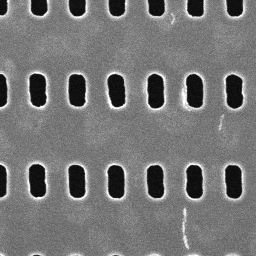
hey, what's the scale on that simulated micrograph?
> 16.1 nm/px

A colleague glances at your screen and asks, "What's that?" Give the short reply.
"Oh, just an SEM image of a regular array of holes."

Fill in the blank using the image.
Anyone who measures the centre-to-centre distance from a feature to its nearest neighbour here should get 630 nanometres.